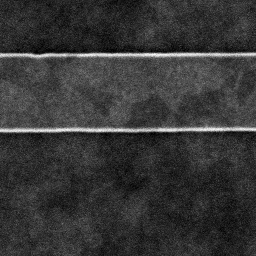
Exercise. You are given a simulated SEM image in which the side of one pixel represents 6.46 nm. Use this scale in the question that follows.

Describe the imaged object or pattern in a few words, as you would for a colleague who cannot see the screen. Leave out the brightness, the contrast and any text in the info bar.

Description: one or a few lines or trenches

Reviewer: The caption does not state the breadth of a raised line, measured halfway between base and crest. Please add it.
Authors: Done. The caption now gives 492 nm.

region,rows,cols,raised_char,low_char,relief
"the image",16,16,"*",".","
................
................
................
****************
****************
****************
****************
****************
................
................
................
................
................
................
................
................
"